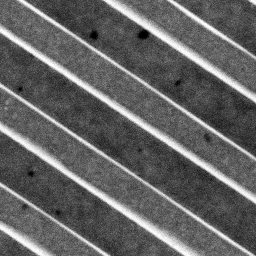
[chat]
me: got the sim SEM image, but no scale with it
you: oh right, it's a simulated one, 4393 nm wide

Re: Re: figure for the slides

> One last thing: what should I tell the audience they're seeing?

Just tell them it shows lines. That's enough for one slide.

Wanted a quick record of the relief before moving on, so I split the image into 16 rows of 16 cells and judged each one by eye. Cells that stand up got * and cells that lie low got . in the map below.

**.....****.....
****.....****...
.****.....****..
..*****.....****
....****.....***
.....*****.....*
**.....****.....
***.....****....
.****.....****..
..****.....****.
....****.....***
.....****.....**
**.....****.....
***.....****....
*****.....****..
..****.....****.